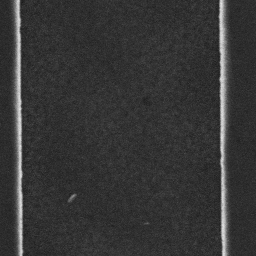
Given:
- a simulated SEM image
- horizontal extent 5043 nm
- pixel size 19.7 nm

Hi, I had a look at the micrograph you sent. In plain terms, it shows lines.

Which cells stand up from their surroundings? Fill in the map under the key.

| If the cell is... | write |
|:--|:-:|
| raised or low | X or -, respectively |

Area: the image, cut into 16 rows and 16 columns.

X-------------XX
X-------------XX
X-------------XX
X-------------XX
X-------------XX
X-------------XX
X-------------XX
X-------------XX
X-------------XX
X-------------XX
X-------------XX
X-------------XX
X-------------XX
X-------------XX
X-------------XX
X-------------XX